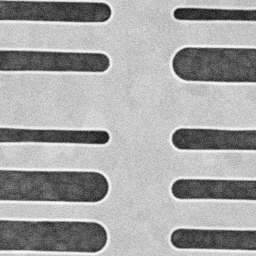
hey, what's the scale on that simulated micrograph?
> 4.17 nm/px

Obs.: groups of lines, slits or small figures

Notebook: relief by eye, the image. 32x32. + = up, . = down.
.............+++++++++++++++++++
..............++++++++..........
..............++++++++..........
++++++++++++++++++++++++++++++++
++++++++++++++++++++++++++++++++
++++++++++++++++++++++++++++++++
...........+++++++++++..........
..............++++++++..........
..............+++++++...........
++++++++++++++++++++++..........
++++++++++++++++++++++++++++++++
++++++++++++++++++++++++++++++++
++++++++++++++++++++++++++++++++
++++++++++++++++++++++++++++++++
++++++++++++++++++++++++++++++++
++++++++++++++++++++++++++++++++
.............+++++++++..........
..............+++++++...........
++++++++++++++++++++++..........
++++++++++++++++++++++++++++++++
++++++++++++++++++++++++++++++++
............++++++++++++++++++++
.............+++++++++..........
..............+++++++...........
.............+++++++++..........
++++++++++++++++++++++++++++++++
++++++++++++++++++++++++++++++++
...+++++++++++++++++++++++++++++
.............+++++++++...+++++++
.............++++++++...........
.............++++++++...........
+++.........++++++++++++++++++++